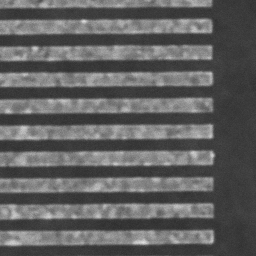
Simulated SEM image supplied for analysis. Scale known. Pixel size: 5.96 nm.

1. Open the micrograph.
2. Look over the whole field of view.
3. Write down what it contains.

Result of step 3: wiring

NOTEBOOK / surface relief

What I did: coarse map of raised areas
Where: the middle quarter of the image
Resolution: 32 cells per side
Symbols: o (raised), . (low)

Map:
................................
................................
oooooooooooooooooooooooooooooooo
oooooooooooooooooooooooooooooooo
oooooooooooooooooooooooooooooooo
ooo.............................
................................
................................
................................
oooooooooooooooooooooooooooooooo
oooooooooooooooooooooooooooooooo
oooooooooooooooooooooooooooooooo
................................
................................
................................
..............................oo
oooooooooooooooooooooooooooooooo
oooooooooooooooooooooooooooooooo
oooooooooooooooooooooooooo......
................................
................................
................................
oooooooooooooooooooooooooooooooo
oooooooooooooooooooooooooooooooo
oooooooooooooooooooooooooooooooo
................................
................................
................................
................................
oooooooooooooooooooooooooooooooo
oooooooooooooooooooooooooooooooo
oooooooooooooooooooooooooooooooo